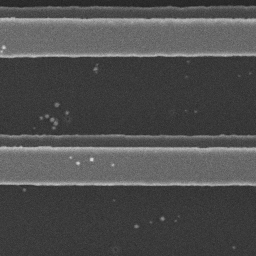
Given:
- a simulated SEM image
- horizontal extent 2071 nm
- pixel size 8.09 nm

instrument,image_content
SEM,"lines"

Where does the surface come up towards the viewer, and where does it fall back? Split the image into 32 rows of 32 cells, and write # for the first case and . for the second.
................................
################################
################################
################################
################################
################################
################################
................................
................................
................................
................................
................................
................................
................................
................................
................................
................................
################################
################################
################################
################################
################################
################################
................................
................................
................................
................................
................................
................................
................................
................................
................................